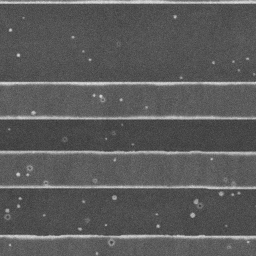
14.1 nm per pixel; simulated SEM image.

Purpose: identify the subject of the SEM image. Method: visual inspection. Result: lines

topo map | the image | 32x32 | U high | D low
DDDDDDDDDDDDDDDDDDDDDDDDDDDDDDDD
DDDDDDDDDDDDDDDDDDDDDDDDDDDDDDDD
DDDDDDDDDDDDDDDDDDDDDDDDDDDDDDDD
DDDDDDDDDDDDDDDDDDDDDDDDDDDDDDDD
DDDDDDDDDDDDDDDDDDDDDDDDDDDDDDDD
DDDDDDDDDDDDDDDDDDDDDDDDDDDDDDDD
DDDDDDDDDDDDDDDDDDDDDDDDDDDDDDDD
DDDDDDDDDDDDDDDDDDDDDDDDDDDDDDDD
DDDDDDDDDDDDDDDDDDDDDDDDDDDDDDDD
DDDDDDDDDDDDDDDDDDDDDDDDDDDDDDDD
UUUUUUUUUUUUUUUUUUUUUUUUUUUUUUUU
UUUUUUUUUUUUUUUUUUUUUUUUUUUUUUUU
UUUUUUUUUUUUUUUUUUUUUUUUUUUUUUUU
UUUUUUUUUUUUUUUUUUUUUUUUUUUUUUUU
UUUUUUUUUUUUUUUUUUUUUUUUUUUUUUUU
DDDDDDDDDDDDDDDDDDDDDDDDDDDDDDDD
DDDDDDDDDDDDDDDDDDDDDDDDDDDDDDDD
DDDDDDDDDDDDDDDDDDDDDDDDDDDDDDDD
DDDDDDDDDDDDDDDDDDDDDDDDDDDDDDDD
UUUUUUUUUUUUUUUUUUUUUUUUUUUUUUUU
UUUUUUUUUUUUUUUUUUUUUUUUUUUUUUUU
UUUUUUUUUUUUUUUUUUUUUUUUUUUUUUUU
UUUUUUUUUUUUUUUUUUUUUUUUUUUUUUUU
DDDDDDDDDDDDDDDDDDDDDDDDDDDDUUUU
DDDDDDDDDDDDDDDDDDDDDDDDDDDDDDDD
DDDDDDDDDDDDDDDDDDDDDDDDDDDDDDDD
DDDDDDDDDDDDDDDDDDDDDDDDDDDDDDDD
DDDDDDDDDDDDDDDDDDDDDDDDDDDDDDDD
DDDDDDDDDDDDDDDDDDDDDDDDDDDDDDDD
UUUUDDDDUUUUUDDDUUUUDDDDDDDDDDDD
UUUUUUUUUUUUUUUUUUUUUUUUUUUUUUUU
UUUUUUUUUUUUUUUUUUUUUUUUUUUUUUUU